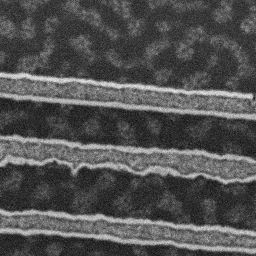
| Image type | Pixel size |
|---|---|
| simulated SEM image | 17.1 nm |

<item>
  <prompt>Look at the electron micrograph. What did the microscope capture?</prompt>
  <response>one or a few lines or trenches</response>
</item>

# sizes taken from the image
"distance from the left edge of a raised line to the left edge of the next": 1150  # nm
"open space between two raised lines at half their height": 771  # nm